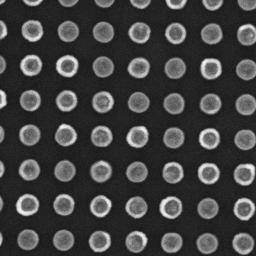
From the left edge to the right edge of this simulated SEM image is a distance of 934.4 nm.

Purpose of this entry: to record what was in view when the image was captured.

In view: a regular array of raised bodies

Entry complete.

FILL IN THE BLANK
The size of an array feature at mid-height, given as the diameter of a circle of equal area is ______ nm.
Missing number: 76.5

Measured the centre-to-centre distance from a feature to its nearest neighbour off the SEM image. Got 34.7 px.